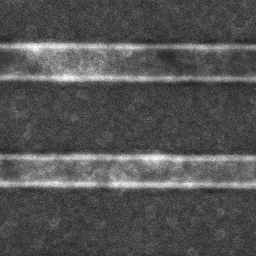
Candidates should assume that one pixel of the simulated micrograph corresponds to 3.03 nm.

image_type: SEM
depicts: one or a few lines or trenches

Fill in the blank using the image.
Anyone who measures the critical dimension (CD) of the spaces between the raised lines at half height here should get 234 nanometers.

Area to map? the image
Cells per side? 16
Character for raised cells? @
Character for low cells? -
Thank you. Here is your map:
----------------
----------------
----------------
@@@@@@@@@@@@@@@@
@@@@@@@@@@@@@@@@
----------------
----------------
----------------
----------------
----------------
@@@@@@@@@@@@@@@@
@@@@@@@@@@@@@@@@
----------------
----------------
----------------
----------------